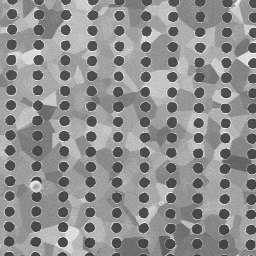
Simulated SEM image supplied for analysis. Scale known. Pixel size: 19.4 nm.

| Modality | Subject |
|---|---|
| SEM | a regular array of holes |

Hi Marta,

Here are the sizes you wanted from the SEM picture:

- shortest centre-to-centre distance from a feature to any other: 292 nm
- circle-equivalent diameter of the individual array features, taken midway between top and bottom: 212 nanometres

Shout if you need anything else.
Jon